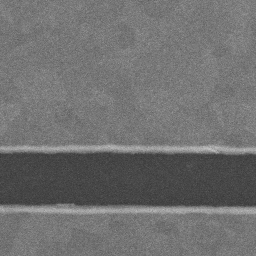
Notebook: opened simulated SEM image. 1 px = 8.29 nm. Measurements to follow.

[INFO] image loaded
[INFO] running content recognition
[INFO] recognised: one or a few lines or trenches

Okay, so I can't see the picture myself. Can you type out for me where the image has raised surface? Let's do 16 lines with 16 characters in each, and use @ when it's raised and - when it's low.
@@@@@@@@@@@@@@@@
@@@@@@@@@@@@@@@@
@@@@@@@@@@@@@@@@
@@@@@@@@@@@@@@@@
@@@@@@@@@@@@@@@@
@@@@@@@@@@@@@@@@
@@@@@@@@@@@@@@@@
@@@@@@@@@@@@@@@@
@@@@@@@@@@@@@@@@
----------------
----------------
----------------
----------------
@@@@@@@@@@@@@@@@
@@@@@@@@@@@@@@@@
@@@@@@@@@@@@@@@@